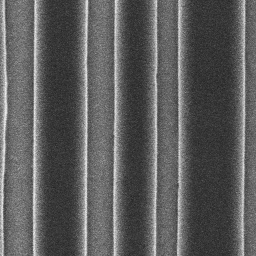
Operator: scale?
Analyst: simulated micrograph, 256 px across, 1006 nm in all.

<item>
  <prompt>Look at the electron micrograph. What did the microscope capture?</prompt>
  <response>one or a few lines or trenches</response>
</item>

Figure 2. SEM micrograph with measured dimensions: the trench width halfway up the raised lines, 110 nm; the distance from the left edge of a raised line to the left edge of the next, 0.297 micrometres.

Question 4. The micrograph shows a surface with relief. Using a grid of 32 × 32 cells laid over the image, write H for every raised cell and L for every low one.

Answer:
LLLLHHHHHHHLLLHHHHHHLLHHHHHHHHHL
LLLLHHHHHHHLLLHHHHHHLLHHHHHHHHHL
HLLLHHHHHHHLLLHHHHHHLLHHHHHHHHHL
HLLLHHHHHHHLLLHHHHHHLLHHHHHHHHHL
HLLLHHHHHHHLLLHHHHHHLLHHHHHHHHHL
HLLLHHHHHHHLLLHHHHHHLLHHHHHHHHHL
HLLLHHHHHHHLLLHHHHHHLLHHHHHHHHHL
HLLLHHHHHHHLLLHHHHHHLLHHHHHHHHHL
HLLLHHHHHHHLLLHHHHHHLLHHHHHHHHHL
HLLLHHHHHHHLLLHHHHHHLLHHHHHHHHHL
HLLLHHHHHHHLLLHHHHHLLLHHHHHHHHHL
HLLLHHHHHHHLLLHHHHHLLLHHHHHHHHHL
HLLLHHHHHHHLLLHHHHHLLLHHHHHHHHHL
HLLLHHHHHHHLLLHHHHHLLLHHHHHHHHHL
HLLLHHHHHHHLLLHHHHHLLLHHHHHHHHLL
HLLLHHHHHHHLLLHHHHHLLLHHHHHHHHLL
HLLLHHHHHHHLLLHHHHHHLLHHHHHHHHLL
LLLLHHHHHHHLLLHHHHHHLLHHHHHHHHLL
LLLLHHHHHHHLLLHHHHHHLLHHHHHHHHLL
LLLLHHHHHHHLLLHHHHHHLLHHHHHHHHLL
LLLLHHHHHHHLLLHHHHHLLLHHHHHHHHLL
LLLLHHHHHHHLLLHHHHHLLLHHHHHHHHLL
LLLLHHHHHHHLLLHHHHHLLLHHHHHHHHLL
LLLLHHHHHHHLLLHHHHHLLLHHHHHHHHLL
LLLLHHHHHHHLLLHHHHHLLLHHHHHHHHLL
LLLLHHHHHHHLLLHHHHHLLLHHHHHHHHLL
LLLLHHHHHHHLLLHHHHHLLLHHHHHHHHLL
LLLLHHHHHHHLLLHHHHHLLLHHHHHHHHLL
LLLLHHHHHHHLLLHHHHHLLLHHHHHHHHLL
LLLLHHHHHHHLLLHHHHHLLLHHHHHHHHLL
LLLLHHHHHHHLLLHHHHHLLLHHHHHHHHLL
LLLLHHHHHHHLLLHHHHHLLLHHHHHHHHLL